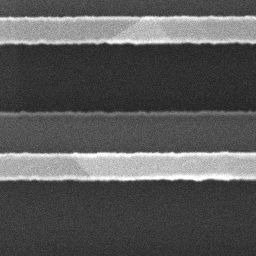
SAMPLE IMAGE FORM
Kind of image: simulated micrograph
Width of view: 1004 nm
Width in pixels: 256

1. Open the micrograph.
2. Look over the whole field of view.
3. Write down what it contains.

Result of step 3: lines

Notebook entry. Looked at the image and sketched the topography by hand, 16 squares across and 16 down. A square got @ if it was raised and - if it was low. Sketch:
@@@@@@@@@@@@@@@@
@@@@@@@@@@@@@@@@
@@@@@@@@@@@@@@@@
----------------
----------------
----------------
----------------
@@@@@@@@@@@@@@@@
@@@@@@@@@@@@@@@@
@@@@@@@@@@@@@@@@
@@@@@@@@@@@@@@@@
----------------
----------------
----------------
----------------
----------------